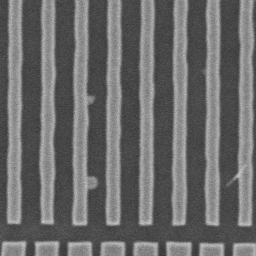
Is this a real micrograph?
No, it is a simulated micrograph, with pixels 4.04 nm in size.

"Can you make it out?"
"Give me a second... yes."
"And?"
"groups of lines, slits or small figures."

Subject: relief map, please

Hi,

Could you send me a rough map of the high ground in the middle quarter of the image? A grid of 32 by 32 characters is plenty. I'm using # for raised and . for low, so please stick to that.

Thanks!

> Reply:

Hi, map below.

...###.....###.....###.....####.
..####.....###.....###.....####.
..####.....###.....###.....####.
..####.....###.....###.....####.
..####.....###.....###.....####.
..###......###.....###......###.
..###......###.....###......###.
...##......###.....###......###.
...###.....###.....###......##..
...###.....###.....###......##..
...###.....###.....###......##..
...###.....###.....###......##..
...###.....###.....###......##..
...###.....###.....###......##..
...###.....###.....###......##..
..####.....###.....###.....###..
..####.....###.....###.....###..
..####.....###.....###.....###..
..####.....###.....###.....###..
..####.....###.....###.....###..
..###......###.....###.....###..
..###......###.....###.....###..
..###......###.....###.....###..
..###......###.....###.....###..
..###......###.....###.....###..
..###......###.....###.....###..
..###......###.....###.....###..
..####.....###.....###.....###..
..####.....###.....###.....###..
..####.....###.....###.....###..
..####.....###.....###.....###..
..####.....###.....###.....###..